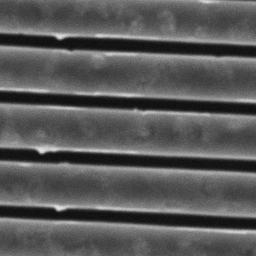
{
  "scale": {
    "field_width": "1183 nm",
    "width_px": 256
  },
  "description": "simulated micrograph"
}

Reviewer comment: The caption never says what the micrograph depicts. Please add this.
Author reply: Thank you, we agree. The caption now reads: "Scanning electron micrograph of parallel lines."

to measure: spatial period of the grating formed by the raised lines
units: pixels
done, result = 57.1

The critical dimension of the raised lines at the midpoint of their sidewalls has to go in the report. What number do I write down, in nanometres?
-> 202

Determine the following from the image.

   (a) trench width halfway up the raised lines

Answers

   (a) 0.0617 µm